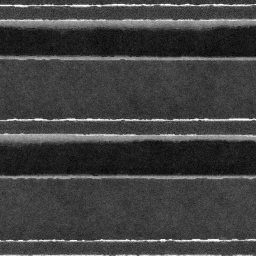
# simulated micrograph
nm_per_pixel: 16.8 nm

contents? lines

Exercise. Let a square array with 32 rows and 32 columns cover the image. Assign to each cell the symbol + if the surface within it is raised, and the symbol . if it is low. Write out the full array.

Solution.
++++++++++++++++++++++++++++++++
++++++++++++++++++++++++++++++++
++++++++++++++++++++++++++++++++
................................
................................
................................
................................
++++++++++++++++++++++++++++++++
++++++++++++++++++++++++++++++++
++++++++++++++++++++++++++++++++
++++++++++++++++++++++++++++++++
++++++++++++++++++++++++++++++++
++++++++++++++++++++++++++++++++
++++++++++++++++++++++++++++++++
++++++++++++++++++++++++++++++++
++++++++++++++++++++++++++++++++
++++++++++++++++++++++++++++++++
................................
................................
................................
................................
................................
++++++++++++++++++++++++++++++++
++++++++++++++++++++++++++++++++
++++++++++++++++++++++++++++++++
++++++++++++++++++++++++++++++++
++++++++++++++++++++++++++++++++
++++++++++++++++++++++++++++++++
++++++++++++++++++++++++++++++++
++++++++++++++++++++++++++++++++
++++++++++++++++++++++++++++++++
++++++++++++++++++++++++++++++++